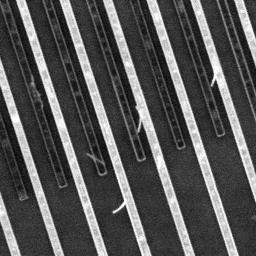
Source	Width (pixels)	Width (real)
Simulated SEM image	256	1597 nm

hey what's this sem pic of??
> parallel lines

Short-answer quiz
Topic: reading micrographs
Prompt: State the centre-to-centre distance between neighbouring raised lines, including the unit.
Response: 129 nm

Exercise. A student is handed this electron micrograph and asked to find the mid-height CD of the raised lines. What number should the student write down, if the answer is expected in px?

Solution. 7.85